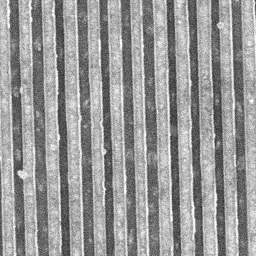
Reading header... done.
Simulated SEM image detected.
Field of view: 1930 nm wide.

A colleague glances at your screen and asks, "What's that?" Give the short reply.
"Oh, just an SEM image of parallel lines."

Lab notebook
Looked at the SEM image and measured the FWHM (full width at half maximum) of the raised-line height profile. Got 91.4 nm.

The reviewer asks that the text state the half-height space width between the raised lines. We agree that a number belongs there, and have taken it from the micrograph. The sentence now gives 77.2 nm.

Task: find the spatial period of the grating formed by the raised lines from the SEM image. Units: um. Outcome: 0.168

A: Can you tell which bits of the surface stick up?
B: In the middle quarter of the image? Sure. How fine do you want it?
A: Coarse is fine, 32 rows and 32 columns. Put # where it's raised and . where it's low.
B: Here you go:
####..###...###..###...###..###.
###...###...###..###...###..###.
###...###...##...###...###..###.
###...###...##...###...###..###.
###....##...##...###...###..####
####...##...##...###...###..####
.###...##...##....##...###..###.
.###...##...###...##...###..####
.###...##...###...##...###...###
.###...##...###...##...###...###
.###...##...###...##...###...###
.###...###..###...##...###...###
.###...###..###...##...###...###
.###...###..###...##....##...###
.###...###..###...##...###..####
.###...###..###...##....##..####
.###...###..###...##....##...###
.###...###..###...##....##...###
.###...###..###...##...###...###
.###...###..###...##...###...###
.###...###..###...##...###...###
.###...###..###...##....##...###
.###...###..###...###...##...###
.###...###..###...###...###..###
.###...###..###...###...##...###
.###...###..###...###...##...###
.###...###..###...###...##...###
.###...###...##...###...##...###
.###...###..###...###...###..###
.###...###..###...###...###..###
.###...###..###...###...###..###
.###....##..###...###...###..###